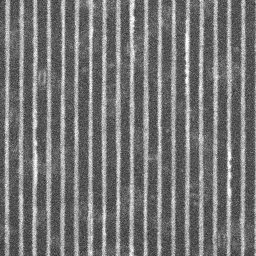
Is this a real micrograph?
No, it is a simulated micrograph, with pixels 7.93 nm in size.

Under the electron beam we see parallel lines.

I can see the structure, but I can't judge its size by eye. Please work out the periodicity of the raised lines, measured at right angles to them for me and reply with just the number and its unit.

110 nanometres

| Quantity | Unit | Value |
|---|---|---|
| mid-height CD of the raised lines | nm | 23.8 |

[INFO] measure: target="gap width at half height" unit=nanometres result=88.2